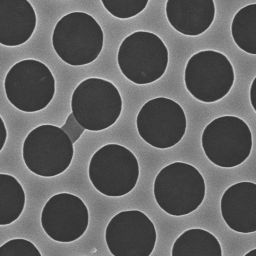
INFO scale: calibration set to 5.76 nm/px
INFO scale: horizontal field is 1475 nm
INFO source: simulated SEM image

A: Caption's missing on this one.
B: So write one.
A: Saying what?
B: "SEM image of a regular array of holes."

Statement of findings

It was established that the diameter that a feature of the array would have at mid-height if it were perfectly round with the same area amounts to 294 nm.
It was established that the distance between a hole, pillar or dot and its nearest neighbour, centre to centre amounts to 67.4 px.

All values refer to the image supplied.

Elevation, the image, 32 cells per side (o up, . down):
....ooooooooo.....ooo......ooooo
....ooooo.oooo...oooo......ooo..
....oooo....ooooooooo......oo...
....ooo......ooooooooo....ooo...
....ooo......ooo....ooooooooo...
...oooo......oo.....oooooooooo..
ooooooo......oo......oooo..oooo.
oooooooo....ooo......ooo.....ooo
o.....ooooooooo......oo......ooo
o......ooooooooo....ooo......ooo
o......ooo....ooo.ooooo......ooo
o......oo......ooooooooo....ooo.
o.....ooo......oooo..oooo..oooo.
oo...oooo......ooo.....ooooooooo
ooooooooo......oo......ooooo.ooo
.ooooooo......ooo......ooo.....o
.ooo......ooooooo......oo......o
.oo.......oooooooo.....oo......o
ooo......oooo...oooo.oooo......o
ooo......ooo.....ooooooooo.....o
ooo......oo......oooo..oooo...oo
oooo....ooo......ooo.....ooooooo
..ooooooooo......oo......ooooooo
...ooooooooo.....oo.......ooo...
...oooo..ooooo.oooo.......oo....
...ooo.....ooooooooo.....ooo....
...oo......oooo...ooo...oooo....
..ooo......ooo.....ooooooooo....
ooooo......oo......oooooooooo...
oooooo....ooo.......oo.....ooooo
o...ooooooooo......ooo.....ooooo
.....ooooooooo.....oo.......ooo.